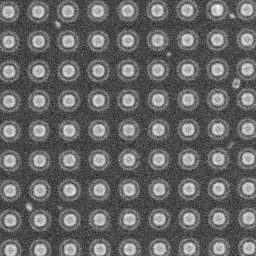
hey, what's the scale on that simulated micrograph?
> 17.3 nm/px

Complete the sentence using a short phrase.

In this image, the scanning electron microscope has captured an array of small figures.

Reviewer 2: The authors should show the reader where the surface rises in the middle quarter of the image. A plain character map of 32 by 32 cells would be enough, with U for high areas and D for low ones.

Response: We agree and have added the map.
UUUDDDUUUUUDDDUUUUDDDUUUUUDDDUUU
UUUDDDUUUUUDDDUUUUDDDUUUUUDDDUUU
UUUDDDUUUUUDDDUUUUDDDUUUUUDDDUUU
UUUDDDDUUUDDDDUUUUDDDDUUUDDDDDUU
DDDDDDDDDDDDDDDDDDDDDDDDDDDDDDDD
DDDDDDDDDDDDDDDDDDDDDDDDDDDDDDDD
DDDDDDDDDDDDDDDDDDDDDDDDDDDDDDDD
UUUDDDDUUUUDDDUUUUDDDDUUUDDDDUUU
UUUUDDUUUUUDDDUUUUDDDUUUUUDDDUUU
UUUUDDUUUUUDDDUUUUDDDUUUUUDDDUUU
UUUDDDDUUUUDDDUUUUDDDDUUUDDDDUUU
UUDDDDDDDDDDDDDDDDDDDDDDDDDDDDDD
DDDDDDDDDDDDDDDDDDDDDDDDDDDDDDDD
DDDDDDDDDDDDDDDDDDDDDDDDDDDDDDDD
UUDDDDDDUUDDDDDUUUDDDDUUUDDDDUUU
UUUDDDDUUUUDDDUUUUDDDUUUUUDDDUUU
UUUUDDUUUUUDDDUUUUDDDUUUUUDDDUUU
UUUDDDDUUUUDDDUUUUDDDUUUUUDDDUUU
UUUDDDDUUUDDDDDUUUDDDDUUUDDDDDUU
DDDDDDDDDDDDDDDDDDDDDDDDDDDDDDDD
DDDDDDDDDDDDDDDDDDDDDDDDDDDDDDDD
DDDDDDDDDDDDDDDDDDDDDDDDDDDDDDUU
UUUDDDDUUUUDDDUUUUDDDDUUUUDDDUUU
UUUUDDUUUUUDDDUUUUUDDUUUUUDDDUUU
UUUUDDDUUUUDDDUUUUUDDUUUUUDDDUUU
UUUDDDDUUUUDDDUUUUDDDDUUUDDDDUUU
DUDDDDDDDDDDDDDDDDDDDDDDDDDDDDDD
DDDDDDDDDDDDDDDDDDDDDDDDDDDDDDDD
DDDDDDDDDDDDDDDDDDDDDDDDDDDDDDDD
UUUDDDDDUUDDDDDUUUDDDDUUUDDDDDUU
UUUUDDDUUUUDDDUUUUDDDDUUUUDDDUUU
UUUUDDUUUUUDDDUUUUUDDDUUUUDDDUUU